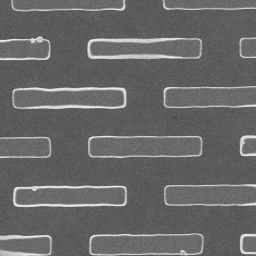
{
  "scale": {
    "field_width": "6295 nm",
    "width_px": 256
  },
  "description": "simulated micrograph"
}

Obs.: groups of lines, slits or small figures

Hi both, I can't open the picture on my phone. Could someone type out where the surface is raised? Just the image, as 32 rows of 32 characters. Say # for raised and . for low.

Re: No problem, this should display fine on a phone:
..##############....############
................................
................................
................................
................................
######.....##############.....##
######.....##############.....##
................................
................................
................................
................................
..##############.....###########
..##############.....###########
................................
................................
................................
................................
######.....##############.....##
######.....##############.....##
######......####..##.##.........
................................
................................
................................
....###########......###########
..##############.....###########
..#############......##########.
................................
................................
................................
............#############......#
######.....##############.....##
######.....##############......#